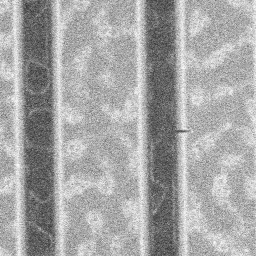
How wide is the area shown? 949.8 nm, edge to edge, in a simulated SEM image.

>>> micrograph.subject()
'one or a few lines or trenches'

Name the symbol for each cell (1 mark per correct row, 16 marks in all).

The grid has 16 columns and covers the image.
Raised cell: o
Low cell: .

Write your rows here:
o..oooooo..ooooo
o..oooooo..ooooo
o..oooooo..ooooo
o...ooooo..ooooo
o...ooooo..ooooo
o...ooooo..ooooo
o...ooooo..ooooo
o...ooooo..ooooo
o...ooooo..ooooo
o...ooooo..ooooo
o...ooooo..ooooo
o...ooooo..ooooo
o...ooooo..ooooo
o...ooooo..ooooo
o...ooooo..ooooo
o...ooooo..ooooo